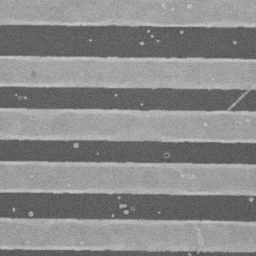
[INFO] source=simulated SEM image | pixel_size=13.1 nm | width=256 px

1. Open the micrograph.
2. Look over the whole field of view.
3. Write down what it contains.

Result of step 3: lines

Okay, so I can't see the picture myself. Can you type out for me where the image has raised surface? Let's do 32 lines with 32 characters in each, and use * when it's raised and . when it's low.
********************************
********************************
********************************
................................
................................
................................
................................
*******************************.
********************************
********************************
********************************
................................
................................
................................
********************************
********************************
********************************
.....................***********
................................
................................
******..*.*.....................
********************************
********************************
********************************
................................
................................
................................
**..............................
********************************
********************************
********************************
................................